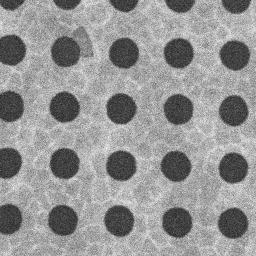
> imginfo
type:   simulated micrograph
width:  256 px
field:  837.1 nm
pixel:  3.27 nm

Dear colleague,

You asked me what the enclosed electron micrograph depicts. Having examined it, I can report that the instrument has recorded a regular array of holes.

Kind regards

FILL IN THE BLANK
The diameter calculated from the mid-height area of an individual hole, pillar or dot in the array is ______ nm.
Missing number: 102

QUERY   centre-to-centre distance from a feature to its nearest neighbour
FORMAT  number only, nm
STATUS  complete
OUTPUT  181